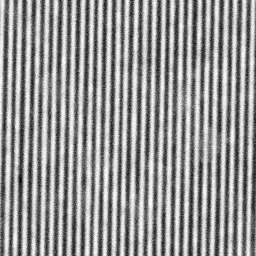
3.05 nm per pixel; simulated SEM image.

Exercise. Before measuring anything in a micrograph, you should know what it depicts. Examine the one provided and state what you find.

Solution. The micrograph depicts parallel lines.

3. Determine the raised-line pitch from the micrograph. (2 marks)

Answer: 27.3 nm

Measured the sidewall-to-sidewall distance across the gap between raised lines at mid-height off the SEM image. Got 17.9 nm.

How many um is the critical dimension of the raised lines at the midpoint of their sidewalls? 0.0099